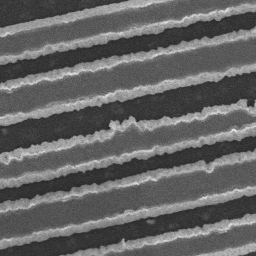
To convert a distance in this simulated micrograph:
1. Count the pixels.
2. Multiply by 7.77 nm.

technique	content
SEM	one or a few lines or trenches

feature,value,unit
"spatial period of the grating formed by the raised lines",462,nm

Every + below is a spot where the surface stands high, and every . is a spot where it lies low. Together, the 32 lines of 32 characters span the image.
................++++++++++++++++
...........+++++++++++++++++++..
......+++++++++++++++++++.......
..+++++++++++++++++++...........
+++++++++++++++.............++++
+++++++++++.............++++++++
++++++..............++++++++++++
++............++++++++++++++++++
.........+++++++++++++++++++++++
.....+++++++++++++++++++++++....
.++++++++++++++++++++++.........
++++++++++++++++++..............
+++++++++++++...................
++++++++....................++++
++++....................++++++++
...............+++++++++++++++++
.............+++++++++++++++++++
.........++++++++++++++++++.....
....++++++++++++++++++..........
+++++++++++++++++.............++
+++++++++++++..............+++++
++++++++............++++++++++++
++++............++++++++++++++++
...........+++++++++++++++++++++
......+++++++++++++++++++++++...
..+++++++++++++++++++++++.......
++++++++++++++++++++............
++++++++++++++++..............++
+++++++++++...............++++++
++++++...............+++++++++++
+..............+.+++++++++++++++
...........+++++++++++++++++++..